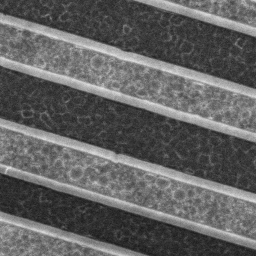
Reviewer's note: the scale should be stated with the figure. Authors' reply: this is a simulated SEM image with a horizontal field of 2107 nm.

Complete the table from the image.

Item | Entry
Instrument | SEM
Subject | one or a few lines or trenches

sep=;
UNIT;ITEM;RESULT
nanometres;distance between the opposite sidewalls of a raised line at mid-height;349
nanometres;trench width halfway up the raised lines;484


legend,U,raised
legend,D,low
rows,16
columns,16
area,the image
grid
DDDDDDDDDDDUUUUU
UDDDDDDDDDDDDDUU
UUUUUDDDDDDDDDDD
UUUUUUUUDDDDDDDD
DDUUUUUUUUUDDDDD
DDDDDDUUUUUUUUUD
DDDDDDDDDUUUUUUU
DDDDDDDDDDDDUUUU
UUUDDDDDDDDDDDDD
UUUUUUDDDDDDDDDD
UUUUUUUUUDDDDDDD
DDDUUUUUUUUUUDDD
DDDDDDDUUUUUUUUU
DDDDDDDDDDUUUUUU
UUUDDDDDDDDDDUUU
UUUUUUUDDDDDDDDD